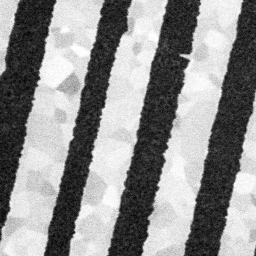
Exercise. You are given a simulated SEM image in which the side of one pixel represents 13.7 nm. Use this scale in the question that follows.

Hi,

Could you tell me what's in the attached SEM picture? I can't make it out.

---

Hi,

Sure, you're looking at one or a few lines or trenches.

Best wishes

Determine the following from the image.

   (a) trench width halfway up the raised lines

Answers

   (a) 464 nm